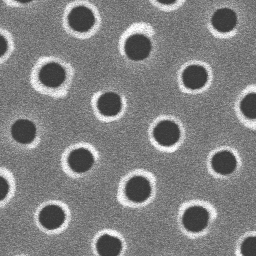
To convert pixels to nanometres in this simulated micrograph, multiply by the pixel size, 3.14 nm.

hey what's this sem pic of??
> a regular array of holes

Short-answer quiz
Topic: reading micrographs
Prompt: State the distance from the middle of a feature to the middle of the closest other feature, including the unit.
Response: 198 nm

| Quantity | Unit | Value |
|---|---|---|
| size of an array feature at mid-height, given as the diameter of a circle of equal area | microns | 0.0801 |